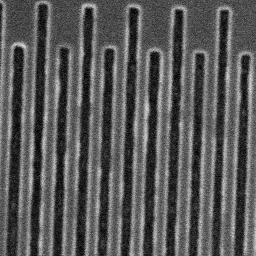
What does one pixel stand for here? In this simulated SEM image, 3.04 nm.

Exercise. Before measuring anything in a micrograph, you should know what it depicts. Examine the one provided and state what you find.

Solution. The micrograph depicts parallel lines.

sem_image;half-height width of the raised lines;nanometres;39.5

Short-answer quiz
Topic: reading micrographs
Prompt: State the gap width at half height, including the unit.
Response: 30.4 nm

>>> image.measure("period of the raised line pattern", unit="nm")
68.8